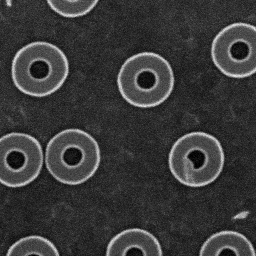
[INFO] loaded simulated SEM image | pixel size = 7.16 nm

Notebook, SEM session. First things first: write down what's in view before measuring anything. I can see ring-shaped raised bodies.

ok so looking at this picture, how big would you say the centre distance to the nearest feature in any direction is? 672 nm